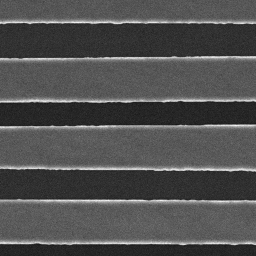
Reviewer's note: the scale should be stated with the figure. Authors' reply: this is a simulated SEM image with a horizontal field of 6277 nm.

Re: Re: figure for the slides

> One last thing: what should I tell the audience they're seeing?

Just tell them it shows lines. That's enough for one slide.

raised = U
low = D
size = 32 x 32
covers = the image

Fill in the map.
UUUUUUUUUUUUUUUUUUUUUUUUUUUUUUUU
UUUUUUUUUUUUUUUUUUUUUUUUUUUUUUUU
UUUUUUUUUUUUUUUUUUUUUUUUUUUUUUUU
DDDDDDDDDDDDDDDDDDDDDDDDDDDDDDDD
DDDDDDDDDDDDDDDDDDDDDDDDDDDDDDDD
DDDDDDDDDDDDDDDDDDDDDDDDDDDDDDDD
DDDDDDDDDDDDDDDDDDDDDDDDDDDDDDDD
UUUUUUUUUUUUUUUUUUUUUUUUUUUUUUUU
UUUUUUUUUUUUUUUUUUUUUUUUUUUUUUUU
UUUUUUUUUUUUUUUUUUUUUUUUUUUUUUUU
UUUUUUUUUUUUUUUUUUUUUUUUUUUUUUUU
UUUUUUUUUUUUUUUUUUUUUUUUUUUUUUUU
UUUUUUUUUUUUUUUUUUUUUUUUUUUUUUUU
DDDDDDDDDDDDDDDDDDDDDDDDDDDDDDDD
DDDDDDDDDDDDDDDDDDDDDDDDDDDDDDDD
DDDDDDDDDDDDDDDDDDDDDDDDDDDDDDDD
UUUUUUUUUUUUUUUUUUUUUUUUUUUUUUUU
UUUUUUUUUUUUUUUUUUUUUUUUUUUUUUUU
UUUUUUUUUUUUUUUUUUUUUUUUUUUUUUUU
UUUUUUUUUUUUUUUUUUUUUUUUUUUUUUUU
UUUUUUUUUUUUUUUUUUUUUUUUUUUUUUUU
DDDDDDDDDDDDDDDDDDDDDDDDDDDDDDDD
DDDDDDDDDDDDDDDDDDDDDDDDDDDDDDDD
DDDDDDDDDDDDDDDDDDDDDDDDDDDDDDDD
DDDDDDDDDDDDDDDDDDDDDDDDDDDDDDDD
UUUUUUUUUUUUUUUUUUUUUUUUUUUUUUUU
UUUUUUUUUUUUUUUUUUUUUUUUUUUUUUUU
UUUUUUUUUUUUUUUUUUUUUUUUUUUUUUUU
UUUUUUUUUUUUUUUUUUUUUUUUUUUUUUUU
UUUUUUUUUUUUUUUUUUUUUUUUUUUUUUUU
DDDDDDUUUDDDDDDDDDDDDDUUDDDDUUDU
DDDDDDDDDDDDDDDDDDDDDDDDDDDDDDDD